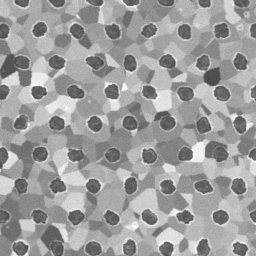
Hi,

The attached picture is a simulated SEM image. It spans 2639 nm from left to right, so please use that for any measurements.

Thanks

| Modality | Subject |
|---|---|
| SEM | a regular array of holes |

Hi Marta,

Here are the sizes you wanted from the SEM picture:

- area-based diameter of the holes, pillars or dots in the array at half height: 160 nanometres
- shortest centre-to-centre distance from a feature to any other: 360 nm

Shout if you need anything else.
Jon